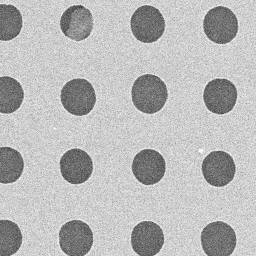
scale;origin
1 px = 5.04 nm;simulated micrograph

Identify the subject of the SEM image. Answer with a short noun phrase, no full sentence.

a regular array of holes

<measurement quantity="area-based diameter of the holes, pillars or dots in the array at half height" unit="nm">180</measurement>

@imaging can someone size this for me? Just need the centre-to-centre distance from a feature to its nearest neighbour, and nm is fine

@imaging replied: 353